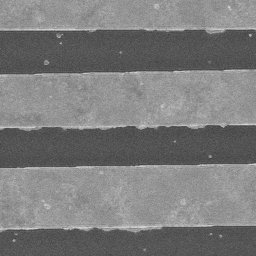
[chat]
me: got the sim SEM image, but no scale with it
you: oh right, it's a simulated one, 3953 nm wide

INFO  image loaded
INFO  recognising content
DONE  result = lines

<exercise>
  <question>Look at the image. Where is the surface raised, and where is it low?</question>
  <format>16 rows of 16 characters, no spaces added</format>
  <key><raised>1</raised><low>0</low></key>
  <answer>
1111111111111111
1111111111111111
0000000000000000
0000000000000000
0000000000111111
1111111111111111
1111111111111111
1111111111111111
0000000000000000
0000000000000000
0111111111111111
1111111111111111
1111111111111111
1111111111111111
0000000000000000
0000000000000000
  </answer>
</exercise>